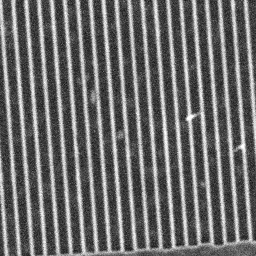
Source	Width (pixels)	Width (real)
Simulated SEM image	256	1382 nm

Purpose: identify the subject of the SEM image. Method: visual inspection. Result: parallel lines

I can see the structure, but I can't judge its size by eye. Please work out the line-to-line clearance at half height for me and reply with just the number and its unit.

59.2 nm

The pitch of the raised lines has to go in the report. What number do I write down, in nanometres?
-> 69.4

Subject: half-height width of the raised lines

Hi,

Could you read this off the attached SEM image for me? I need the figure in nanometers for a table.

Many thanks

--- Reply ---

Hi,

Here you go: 13.4